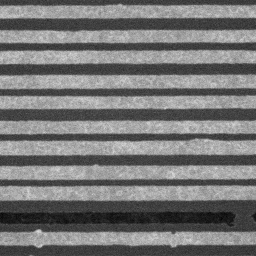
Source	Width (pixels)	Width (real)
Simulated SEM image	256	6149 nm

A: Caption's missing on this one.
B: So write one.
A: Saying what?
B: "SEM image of parallel lines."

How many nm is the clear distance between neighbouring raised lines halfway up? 266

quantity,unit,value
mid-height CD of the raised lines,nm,288